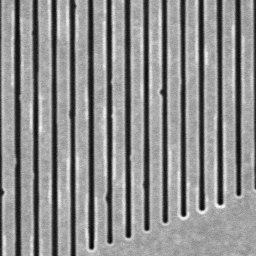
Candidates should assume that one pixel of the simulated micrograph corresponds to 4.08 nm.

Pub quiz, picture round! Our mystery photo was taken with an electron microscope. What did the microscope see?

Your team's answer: parallel lines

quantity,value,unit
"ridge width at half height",46.4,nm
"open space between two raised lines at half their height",28.6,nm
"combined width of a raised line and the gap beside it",0.0751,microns